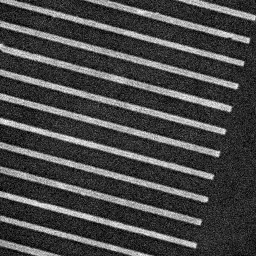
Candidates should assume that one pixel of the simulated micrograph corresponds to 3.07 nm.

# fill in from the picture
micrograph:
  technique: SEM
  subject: parallel lines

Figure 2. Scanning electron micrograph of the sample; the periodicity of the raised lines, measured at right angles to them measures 0.0721 micrometres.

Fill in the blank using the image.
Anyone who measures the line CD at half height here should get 14.9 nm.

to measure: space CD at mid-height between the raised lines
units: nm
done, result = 56.3